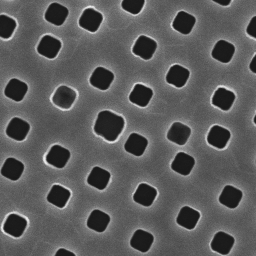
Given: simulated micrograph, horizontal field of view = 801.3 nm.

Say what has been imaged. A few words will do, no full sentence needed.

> a regular array of holes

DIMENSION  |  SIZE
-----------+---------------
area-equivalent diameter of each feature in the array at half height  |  67.9 nm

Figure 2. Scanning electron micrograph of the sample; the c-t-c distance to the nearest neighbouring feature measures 132 nanometers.